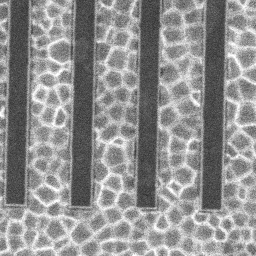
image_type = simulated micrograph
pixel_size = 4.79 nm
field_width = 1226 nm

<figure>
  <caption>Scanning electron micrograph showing one or a few lines or trenches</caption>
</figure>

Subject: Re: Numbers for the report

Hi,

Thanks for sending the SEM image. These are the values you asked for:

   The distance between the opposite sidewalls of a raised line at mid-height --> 103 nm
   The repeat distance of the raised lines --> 313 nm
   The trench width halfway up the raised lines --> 211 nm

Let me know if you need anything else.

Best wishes